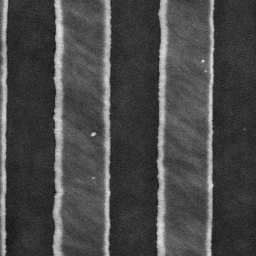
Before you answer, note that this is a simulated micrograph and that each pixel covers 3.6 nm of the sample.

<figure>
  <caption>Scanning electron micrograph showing lines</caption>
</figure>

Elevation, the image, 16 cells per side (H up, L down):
LLLHHHHLLLHHHLLL
LLLLHHHLLLHHHLLL
LLLLHHHLLLHHHLLL
LLLHHHHLLLHHHLLL
LLLHHHHLLLHHHLLL
LLLLHHHLLLHHHLLL
LLLLHHHLLLHHHLLL
LLLHHHHLLLHHHLLL
LLLLHHHLLLHHHLLL
LLLLHHHLLLHHHLLL
LLLHHHHLLLHHHLLL
LLLLHHHLLLHHHLLL
LLLHHHHLLLHHHLLL
LLLHHHHLLLHHHLLL
LLLHHHHLLLHHHLLL
LLLHHHHLLLHHHLLL